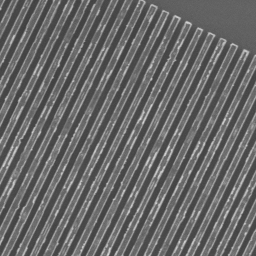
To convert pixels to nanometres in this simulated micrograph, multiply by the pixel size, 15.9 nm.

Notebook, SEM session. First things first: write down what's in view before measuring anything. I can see parallel lines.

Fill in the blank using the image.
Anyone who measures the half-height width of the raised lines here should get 106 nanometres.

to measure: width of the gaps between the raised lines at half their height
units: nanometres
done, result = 93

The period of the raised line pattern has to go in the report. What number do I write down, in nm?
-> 203